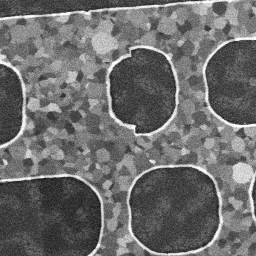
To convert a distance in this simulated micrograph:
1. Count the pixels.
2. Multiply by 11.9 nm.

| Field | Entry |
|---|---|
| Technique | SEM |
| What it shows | one or a few lines or trenches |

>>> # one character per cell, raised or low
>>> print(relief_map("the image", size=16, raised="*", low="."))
........********
****************
***************.
********..***...
.******....**...
.******....**...
.******....**...
.******....***..
.***************
****************
**********..****
.....***.....***
......**......**
......**......**
......**......**
......***....***